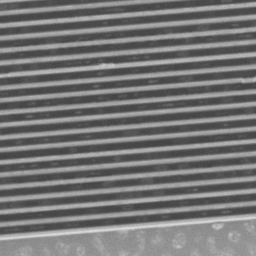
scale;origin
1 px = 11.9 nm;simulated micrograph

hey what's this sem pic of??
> parallel lines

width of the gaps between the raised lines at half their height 0.0978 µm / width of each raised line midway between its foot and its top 53.3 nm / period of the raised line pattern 147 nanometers